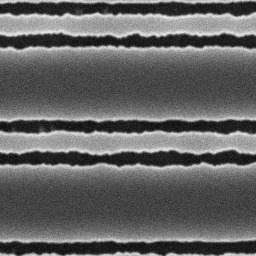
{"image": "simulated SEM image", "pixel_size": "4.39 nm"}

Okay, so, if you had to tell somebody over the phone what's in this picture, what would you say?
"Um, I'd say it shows lines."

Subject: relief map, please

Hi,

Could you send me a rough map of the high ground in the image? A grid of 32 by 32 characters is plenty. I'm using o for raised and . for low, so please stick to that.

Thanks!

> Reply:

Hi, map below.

................................
................................
oooooooooooooooooooooooooooooooo
oooooooooooooooooooooooooooooooo
..............oo................
................................
oooooooooooooooooooooooooooooooo
oooooooooooooooooooooooooooooooo
oooooooooooooooooooooooooooooooo
oooooooooooooooooooooooooooooooo
oooooooooooooooooooooooooooooooo
oooooooooooooooooooooooooooooooo
oooooooooooooooooooooooooooooooo
oooooooooooooooooooooooooooooooo
oooooooooooooooooooooooooooooooo
................................
.......o...........o............
oooooooooooooooooooooooooooooooo
oooooooooooooooooooooooooooooooo
................................
............o............o.....o
oooooooooooooooooooooooooooooooo
oooooooooooooooooooooooooooooooo
oooooooooooooooooooooooooooooooo
oooooooooooooooooooooooooooooooo
oooooooooooooooooooooooooooooooo
oooooooooooooooooooooooooooooooo
oooooooooooooooooooooooooooooooo
oooooooooooooooooooooooooooooooo
oooooooooooooooooooooooooooooooo
................................
................................